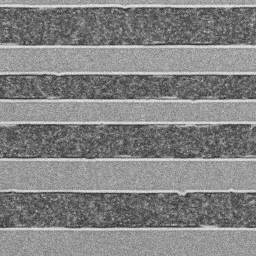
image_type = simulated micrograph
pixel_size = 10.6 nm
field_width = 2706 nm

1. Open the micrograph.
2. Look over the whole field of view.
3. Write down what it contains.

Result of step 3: one or a few lines or trenches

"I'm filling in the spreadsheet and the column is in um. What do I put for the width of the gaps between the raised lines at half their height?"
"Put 0.39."